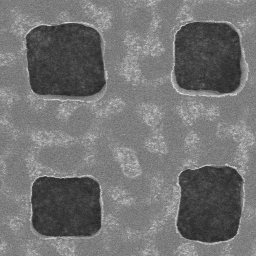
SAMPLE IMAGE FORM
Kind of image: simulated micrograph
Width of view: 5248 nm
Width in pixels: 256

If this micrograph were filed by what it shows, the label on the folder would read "holes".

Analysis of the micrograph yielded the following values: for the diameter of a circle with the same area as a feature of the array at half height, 1530 nanometres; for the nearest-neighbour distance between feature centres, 2940 nm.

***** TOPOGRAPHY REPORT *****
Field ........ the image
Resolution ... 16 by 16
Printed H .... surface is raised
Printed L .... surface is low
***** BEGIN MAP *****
HHHHHHHHHHHHHHHH
HHHHLHHHHHHHLLHH
HHLLLLHHHHHLLLLH
HHLLLLHHHHHLLLLH
HHLLLLLHHHHLLLLH
HHLLLLHHHHHLLLLH
HHHHHHHHHHHHHHHH
HHHHHHHHHHHHHHHH
HHHHHHHHHHHHHHHH
HHHHHHHHHHHHHHHH
HHHHHHHHHHHHHLLH
HHLLLLHHHHHLLLLH
HHLLLLHHHHHLLLLH
HHLLLLHHHHHLLLLH
HHLLLLHHHHHLLLLH
HHHHHHHHHHHHHHHH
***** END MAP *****